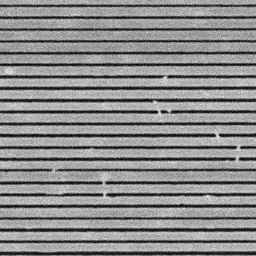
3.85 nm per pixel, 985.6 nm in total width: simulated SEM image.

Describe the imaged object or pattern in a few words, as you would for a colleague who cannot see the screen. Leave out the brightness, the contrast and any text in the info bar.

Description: parallel lines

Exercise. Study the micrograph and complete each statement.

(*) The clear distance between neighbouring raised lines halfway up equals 13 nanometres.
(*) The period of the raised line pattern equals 45.3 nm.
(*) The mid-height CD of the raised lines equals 8.62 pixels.